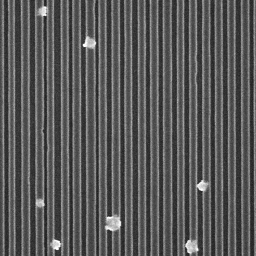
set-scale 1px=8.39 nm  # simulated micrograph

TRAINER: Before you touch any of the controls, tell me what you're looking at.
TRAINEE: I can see parallel lines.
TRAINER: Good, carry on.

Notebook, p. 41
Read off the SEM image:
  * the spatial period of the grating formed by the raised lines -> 0.109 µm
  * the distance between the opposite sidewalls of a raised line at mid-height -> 61.9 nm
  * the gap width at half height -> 46.2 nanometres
